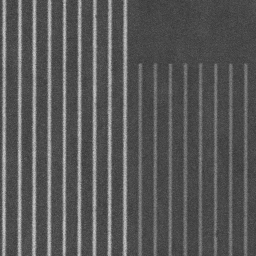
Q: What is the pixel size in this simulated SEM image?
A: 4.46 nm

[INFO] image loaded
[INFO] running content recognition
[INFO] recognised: parallel lines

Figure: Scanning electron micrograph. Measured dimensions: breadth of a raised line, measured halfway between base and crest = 10.6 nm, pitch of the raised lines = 67.5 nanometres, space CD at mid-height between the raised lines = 0.0553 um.